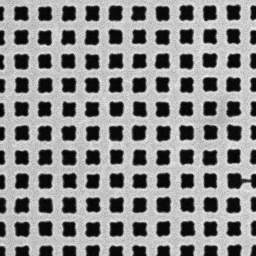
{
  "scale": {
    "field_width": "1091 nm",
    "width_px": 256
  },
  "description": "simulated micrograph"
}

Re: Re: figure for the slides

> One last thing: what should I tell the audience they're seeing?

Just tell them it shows a regular array of holes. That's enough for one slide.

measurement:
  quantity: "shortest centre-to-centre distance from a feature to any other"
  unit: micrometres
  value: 0.0988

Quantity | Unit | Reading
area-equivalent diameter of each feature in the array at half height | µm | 0.0666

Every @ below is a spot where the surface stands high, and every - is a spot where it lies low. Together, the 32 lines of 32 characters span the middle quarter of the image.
---@@----@@----@@----@@---@@@---
@@@@@@@@@@@@@@@@@@@@@@@@@@@@@@@@
@@@@@@@@@@@@@@@@@@@@@@@@@@@@@@@@
---@@@--@@@@--@@@@--@@@---@@@@--
---@@----@@----@@----@@---@@@---
---@@----@@----@@----@@---@@@---
---@@----@@----@@---@@@---@@@---
@@@@@@@@@@@@@@@@@@@@@@@@@@@@@@@@
@@@@@@@@@@@@@@@@@@@@@@@@@@@@@@@@
-@@@@@@@@@@@@@@@@--@@@@---@@@@--
---@@----@@----@@----@@---@@@---
---@@----@@----@@----@@---@@@---
---@@----@@@---@@----@@---@@@---
@@@@@@@@@@@@@@@@@@@@@@@@@@@@@@@@
@@@@@@@@@@@@@@@@@@@@@@@@@@@@@@@@
@@-@@@--@@@@---@@@--@@@@-@@@@---
---@@----@@----@@----@@----@@---
---@@@---@@----@@---@@@----@@---
---@@@---@@----@@---@@@----@@---
@@@@@@@@@@@@@@@@@@@@@@@@@@@@@@@@
@@@@@@@@@@@@@@@@@@@@@@@@@@@@@@@@
--@@@@-@@@@@--@@@@--@@@@@-@@@@@-
---@@----@@----@@----@@---@@@---
---@@@---@@@---@@----@@---@@@---
---@@----@@----@@----@@---@@@---
@@@@@@@@@@@@@@@@@@@@@@@@@@@@@@@@
@@@@@@@@@@@@@@@@@@@@@@@@@@@@@@@@
---@@@@@@@@@---@@@@@@@@@--@@@@--
---@@@---@@----@@----@@---@@@---
---@@@---@@@---@@----@@---@@@---
---@@----@@----@@----@@---@@@---
@@@@@@@@@@@@@@@@@@@@@@@@@@@@@@@@